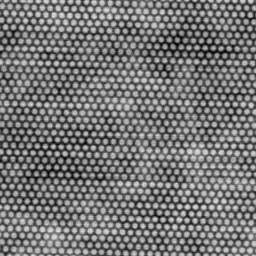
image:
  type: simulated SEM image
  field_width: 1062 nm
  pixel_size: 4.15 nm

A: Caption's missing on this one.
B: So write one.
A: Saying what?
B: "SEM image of a regular array of raised bodies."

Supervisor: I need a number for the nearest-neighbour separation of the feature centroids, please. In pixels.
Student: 7.73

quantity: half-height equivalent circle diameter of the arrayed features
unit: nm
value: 21.5